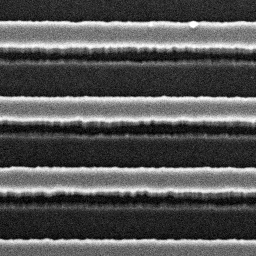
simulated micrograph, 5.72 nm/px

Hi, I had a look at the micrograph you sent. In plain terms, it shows lines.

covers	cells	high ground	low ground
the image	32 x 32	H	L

LLLLLLLLLLLLLLLLLLLLLLLLLLLLLLLL
LLLLLLLLLLLLLLLLLLLLLLLLLLLLLLLL
LLLLLLLLLLLLLLLLLLLLLLLLLLLLLLLL
HHHHHHHHHHHHHHHHHHHHHHHHHHHHHHHH
HHHHHHHHHHHHHHHHHHHHHHHHHHHHHHHH
HHHHHHHHHHHHHHHHHHHHHHHHHHHHHHHH
LLLLLLLLLLLLLLLLLLLLLLLLLLLLLLLL
LLLLLLLLLLLLLLLLLLLLLLLLLLLLLLLL
LLLLLLLLLLLLLLLLLLLLLLLLLLLLLLLL
LLLLLLLLLLLLLLLLLLLLLLLLLLLLLLLL
LLLLLLLLLLLLLLLLLLLLLLLLLLLLLLLL
LLLLLLLLLLLLLLLLLLLLLLLLLLLLLLLL
HHHHHHHHHHHHHHHHHHHHHHHHHHHHHHHH
HHHHHHHHHHHHHHHHHHHHHHHHHHHHHHHH
HHHHHHHHHHHHHHHHHHHHHHHHHHHHHHHH
LLLLLLLLLLLLLLLLLLLLLLLLLLLLLLLL
LLLLLLLLLLLLLLLLLLLLLLLLLLLLLLLL
LLLLLLLLLLLLLLLLLLLLLLLLLLLLLLLL
LLLLLLLLLLLLLLLLLLLLLLLLLLLLLLLL
LLLLLLLLLLLLLLLLLLLLLLLLLLLLLLLL
LLLLLLLLLLLLLLLLLLLLLLLLLLLLLLLL
HHHHHHHHHHHHHHHHHHHHHHHHHHHHHHHH
HHHHHHHHHHHHHHHHHHHHHHHHHHHHHHHH
HHHHHHHHHHHHHHHHHHHHHHHHHHHHHHHH
LLLLLLLLLLLLLLLLLLLLLLLLLLLLLLLL
LLLLLLLLLLLLLLLLLLLLLLLLLLLLLLLL
LLLLLLLLLLLLLLLLLLLLLLLLLLLLLLLL
LLLLLLLLLLLLLLLLLLLLLLLLLLLLLLLL
LLLLLLLLLLLLLLLLLLLLLLLLLLLLLLLL
LLLLLLLLLLLLLLLLLLLLLLLLLLLLLLLL
HHHHHHHHHHHHHHHHHHHHHHHHHHHHHHHH
HHHHHHHHHHHHHHHHHHHHHHHHHHHHHHHH